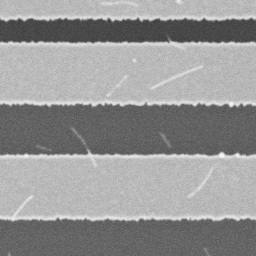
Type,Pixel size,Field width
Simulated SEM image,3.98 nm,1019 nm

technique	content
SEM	lines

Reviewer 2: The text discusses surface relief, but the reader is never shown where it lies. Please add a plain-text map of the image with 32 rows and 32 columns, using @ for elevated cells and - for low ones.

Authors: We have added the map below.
@@@@@@@@@@@@@@@@@@@@@@@@@@@@@@@@
@@@@@@@@@@@@@@@@@@@@@@@@@@@@@@@@
@-------------@-----@---@-@@----
--------------------------------
--------------------------------
@@@@@@@@@@@@@@@@@@@@@@@@@@@@@@@@
@@@@@@@@@@@@@@@@@@@@@@@@@@@@@@@@
@@@@@@@@@@@@@@@@@@@@@@@@@@@@@@@@
@@@@@@@@@@@@@@@@@@@@@@@@@@@@@@@@
@@@@@@@@@@@@@@@@@@@@@@@@@@@@@@@@
@@@@@@@@@@@@@@@@@@@@@@@@@@@@@@@@
@@@@@@@@@@@@@@@@@@@@@@@@@@@@@@@@
@@@@@@@@@@@@@@@@@@@@@@@@@@@@@@@@
--------------------------------
--------------------------------
--------------------------------
--------------------------------
--------------------------------
--------------------------------
@@@@@@@@@@@@@@@@@@@@@@@@@@-@@@@@
@@@@@@@@@@@@@@@@@@@@@@@@@@@@@@@@
@@@@@@@@@@@@@@@@@@@@@@@@@@@@@@@@
@@@@@@@@@@@@@@@@@@@@@@@@@@@@@@@@
@@@@@@@@@@@@@@@@@@@@@@@@@@@@@@@@
@@@@@@@@@@@@@@@@@@@@@@@@@@@@@@@@
@@@@@@@@@@@@@@@@@@@@@@@@@@@@@@@@
@@@@@@@@@@@@@@@@@@@@@@@@@@@@@@@@
-@---@@----@@-@@@----------@----
--------------------------------
--------------------------------
--------------------------------
--------------------------------